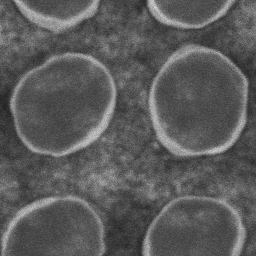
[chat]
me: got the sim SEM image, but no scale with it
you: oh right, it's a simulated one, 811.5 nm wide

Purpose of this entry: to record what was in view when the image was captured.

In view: raised bodies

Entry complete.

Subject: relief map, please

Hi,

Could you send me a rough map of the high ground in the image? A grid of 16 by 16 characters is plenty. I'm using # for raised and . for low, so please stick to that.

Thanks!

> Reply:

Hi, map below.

.#####...#####..
...#.......##...
................
....#......###..
..#####...#####.
.######..######.
.######..######.
.######...#####.
.#####....#####.
...#........##..
................
................
...##......###..
.#####....#####.
######...######.
######...######.